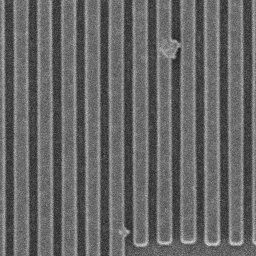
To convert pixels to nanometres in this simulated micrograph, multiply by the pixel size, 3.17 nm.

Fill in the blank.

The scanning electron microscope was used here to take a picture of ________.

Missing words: parallel lines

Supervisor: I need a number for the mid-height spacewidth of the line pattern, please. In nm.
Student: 33.7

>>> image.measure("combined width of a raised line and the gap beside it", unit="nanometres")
75.6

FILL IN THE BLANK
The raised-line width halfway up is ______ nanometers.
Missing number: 42.4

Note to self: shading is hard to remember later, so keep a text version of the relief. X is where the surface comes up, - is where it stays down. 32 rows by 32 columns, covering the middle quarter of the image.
XXX---XXX--XXXX---XXX---XX---XXX
XXX---XXX--XXXX--XXXX---XX---XXX
XXX---XXX--XXXX--XXXX---XX---XXX
XXX---XXX--XXXX--XXXX---XX---XXX
XXX---XXX---XXX--XXXX---XX---XXX
XXX---XXX---XXX--XXXX---XX---XXX
XXX---XXX---XXX--XXXX---XX---XXX
XXX---XXX---XXX--XXXX---XX---XXX
XXX---XXX---XXX--XXXX---XX---XXX
XXX---XXX---XXX--XXXX---XX---XXX
XXX---XXX---XXX--XXXX---XX---XXX
XXX---XXX---XXX--XXXX---XX---XXX
XXX---XXX---XXX--XXXX---XX---XXX
XXX---XXX---XXX--XXXX---XX---XXX
XXX---XXX---XXX--XXXX---XX---XXX
XXX---XXX---XXX--XXXX---XX---XXX
XXX---XXX---XXX--XXXX---XXX--XXX
XXX---XXX---XXX--XXXX---XXX--XXX
XXX---XXX---XXX--XXXX---XXX--XXX
XXX---XXX---XXX--XXXX---XXX--XXX
XXX---XXX---XXX--XXXX---XXX--XXX
XXX---XXX---XXX--XXXX---XXX--XXX
XXX---XXX---XXX--XXXX---XXX--XXX
XXX---XXX---XXX--XXXX---XXX--XXX
XXX---XXX---XXX--XXXX---XXX--XXX
XXX---XXX---XXX--XXXX---XXX--XXX
XXX---XXX---XXX--XXXX---XXX--XXX
XXX---XXX---XXX---XXX---XXX--XXX
XXX---XXX---XXX---XXX---XXX--XXX
XXX---XXX---XXX---XXX---XXX--XXX
XXX---XXX---XXX---XXX--XXXX--XXX
XXX---XXX---XXX---XXX--XXXX--XXX